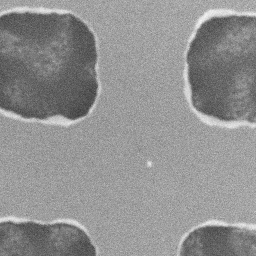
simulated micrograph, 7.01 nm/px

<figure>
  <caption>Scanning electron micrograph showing holes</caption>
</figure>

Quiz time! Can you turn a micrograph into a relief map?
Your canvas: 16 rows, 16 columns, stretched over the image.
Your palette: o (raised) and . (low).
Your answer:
oooooooooooooooo
.....oooooooo...
......oooooo....
......oooooo....
......oooooo....
......oooooo....
......oooooo....
oo..ooooooooo...
oooooooooooooooo
oooooooooooooooo
oooooooooooooooo
oooooooooooooooo
oooooooooooooooo
oooooooooooooooo
.....ooooooo....
......ooooo.....